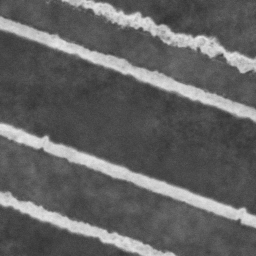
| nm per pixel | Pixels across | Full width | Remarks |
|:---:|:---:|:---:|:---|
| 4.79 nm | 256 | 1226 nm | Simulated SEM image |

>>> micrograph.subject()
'one or a few lines or trenches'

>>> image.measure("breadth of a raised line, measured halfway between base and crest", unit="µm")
0.479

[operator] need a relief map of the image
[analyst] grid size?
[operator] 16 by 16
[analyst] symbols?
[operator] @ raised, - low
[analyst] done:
------@@@@@@@@@@
---------@@@@@@@
@@@--------@@@@@
@@@@@@--------@@
@@@@@@@@@-------
@@@@@@@@@@@-----
@@@@@@@@@@@@@@--
@@@@@@@@@@@@@@@@
-@@@@@@@@@@@@@@@
----@@@@@@@@@@@@
-------@@@@@@@@@
---------@@@@@@@
------------@@@@
@@@------------@
@@@@@@----------
@@@@@@@@@-------